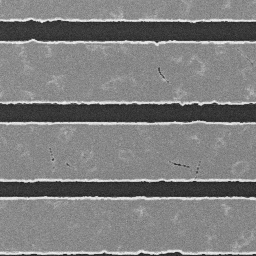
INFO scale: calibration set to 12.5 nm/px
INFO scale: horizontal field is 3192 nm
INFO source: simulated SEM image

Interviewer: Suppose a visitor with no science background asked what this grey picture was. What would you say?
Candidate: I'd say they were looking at one or a few lines or trenches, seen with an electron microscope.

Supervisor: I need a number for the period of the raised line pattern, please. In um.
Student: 0.955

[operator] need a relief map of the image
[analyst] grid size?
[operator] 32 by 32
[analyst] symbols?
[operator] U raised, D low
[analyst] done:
UUUUUUUUUUUUUUUUUUUUUUUUUUUUUUUU
UUUUUUUUUUUUUUUUUUUUUUUUUUUUUUUU
UUUUDUUDUUUUUUUUUUUUUUUUUUUUUUUU
DDDDDDDDDDDDDDDDDDDDDDDDDDDDDDDD
DDDDDDDDDDDDDDDDDDDDDDDDDDDDDDDD
UUUUUUUUUUUUUUUUUUUUUUUUUUUUUUUU
UUUUUUUUUUUUUUUUUUUUUUUUUUUUUUUU
UUUUUUUUUUUUUUUUUUUUUUUUUUUUUUUU
UUUUUUUUUUUUUUUUUUUUUUUUUUUUUUUU
UUUUUUUUUUUUUUUUUUUUUUUUUUUUUUUU
UUUUUUUUUUUUUUUUUUUUUUUUUUUUUUUU
UUUUUUUUUUUUUUUUUUUUUUUUUUUUUUUU
UUUUUUUUUUUUUUUUUUUUUUUUUUUUUUUU
DDDDDDDDDDDDDDDDDDDDDDDDDDDDDDDD
DDDDDDDDDDDDDDDDDDDDDDDDDDDDDDDD
UUUUUUUUUUUUUUUUUUUUUUUUUUUUUUUU
UUUUUUUUUUUUUUUUUUUUUUUUUUUUUUUU
UUUUUUUUUUUUUUUUUUUUUUUUUUUUUUUU
UUUUUUUUUUUUUUUUUUUUUUUUUUUUUUUU
UUUUUUUUUUUUUUUUUUUUUUUUUUUUUUUU
UUUUUUUUUUUUUUUUUUUUUUUUUUUUUUUU
UUUUUUUUUUUUUUUUUUUUUUUUUUUUUUUU
UUUUUUUUUUUUUUUUUUUUUUUUUUUUDUUU
DDDDDDDDDDDDDDDDDDDDDDDDDDDDDDDD
DDDDDDDDDDDDDDDDDDDDDDDDDDDDDDDD
UUUUUUUUUUUUUUUUUUUUUUUUUUUUUUUU
UUUUUUUUUUUUUUUUUUUUUUUUUUUUUUUU
UUUUUUUUUUUUUUUUUUUUUUUUUUUUUUUU
UUUUUUUUUUUUUUUUUUUUUUUUUUUUUUUU
UUUUUUUUUUUUUUUUUUUUUUUUUUUUUUUU
UUUUUUUUUUUUUUUUUUUUUUUUUUUUUUUU
UUUUUUUUUUUUUUUUUUUUUDDUUUUUUUUU